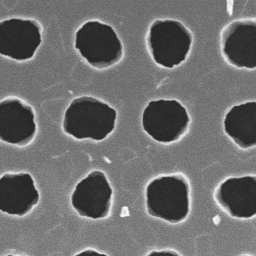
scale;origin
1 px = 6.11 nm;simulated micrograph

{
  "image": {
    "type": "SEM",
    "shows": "holes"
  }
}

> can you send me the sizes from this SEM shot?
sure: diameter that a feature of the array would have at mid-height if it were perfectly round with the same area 267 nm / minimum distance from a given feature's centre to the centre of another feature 460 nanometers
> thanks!